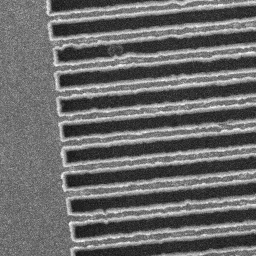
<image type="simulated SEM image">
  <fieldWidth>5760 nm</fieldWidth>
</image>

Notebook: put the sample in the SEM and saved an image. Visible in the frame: parallel lines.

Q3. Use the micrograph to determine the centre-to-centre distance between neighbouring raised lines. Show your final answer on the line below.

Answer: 0.568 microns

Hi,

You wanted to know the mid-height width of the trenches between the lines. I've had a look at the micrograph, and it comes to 328 nm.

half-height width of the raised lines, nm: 238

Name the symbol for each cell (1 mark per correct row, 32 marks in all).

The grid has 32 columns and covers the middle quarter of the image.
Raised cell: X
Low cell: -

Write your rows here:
XXXXXXXXXXXXXXXXX---------------
XXXXX-X-------------------------
--------------------------------
--------------------------XXXXXX
----------------XXXXXXXXXXXXXXXX
------XXXXXXXXXXXXXXXXXXXXXXXX--
XXXXXXXXXXXXXXXXXXXX-X----------
XXXXXXXXXXX---------------------
XX------------------------------
-------------------------------X
---------------------XXXXXXXXXXX
-------X--XXXXXXXXXXXXXXXXXXXXXX
XXXXXXXXXXXXXXXXXXXXXXX-XX------
XXXXXXXXXXXXXXX-----------------
XXXXX---------------------------
--------------------------------
---------------------XXXXXXXXXXX
-------------XXXXXXXXXXXXXXXXXXX
--XXXXXXXXXXXXXXXXXXXXXXXXXX----
XXXXXXXXXXXXXXXXXX--------------
XXXXXXX-------------------------
--------------------------------
-------------------------XXXXXXX
------------------XXXXXXXXXXXXXX
------XXXXXXXXXXXXXXXXXXXXXXXXX-
XXXXXXXXXXXXXXXXXXXXX-X---------
XXXXXXXXXXX---------------------
--------------------------------
-----------------------------XXX
--------------------X-XXXXXXXXXX
---------XXXXXXXXXXXXXXXXXXXXXXX
XXXXXXXXXXXXXXXXXXXXXXXX-X------